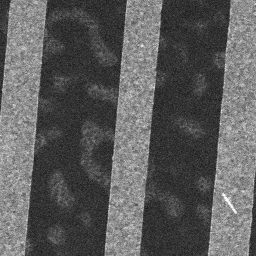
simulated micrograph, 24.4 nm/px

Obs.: one or a few lines or trenches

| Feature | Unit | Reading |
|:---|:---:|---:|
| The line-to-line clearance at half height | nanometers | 1730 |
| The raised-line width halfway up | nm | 849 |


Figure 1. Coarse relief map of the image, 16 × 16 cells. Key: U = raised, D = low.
DUUDDDDDUUDDDDUU
DUUDDDDDUUDDDDUU
UUUDDDDDUUDDDDUU
UUUDDDDDUUDDDDUU
UUUDDDDDUUDDDDUU
UUDDDDDUUUDDDDUU
UUDDDDDUUUDDDDUU
UUDDDDDUUDDDDDUU
UUDDDDDUUDDDDDUU
UUDDDDDUUDDDDDUU
UUDDDDDUUDDDDDUU
UUDDDDDUUDDDDUUU
UUDDDDDUUDDDDUUU
UUDDDDDUUDDDDUUU
UUDDDDDUUDDDDUUU
UUDDDDDUUDDDDUUU